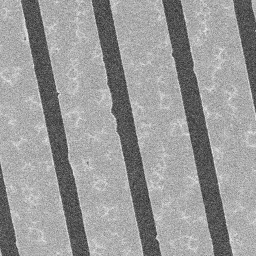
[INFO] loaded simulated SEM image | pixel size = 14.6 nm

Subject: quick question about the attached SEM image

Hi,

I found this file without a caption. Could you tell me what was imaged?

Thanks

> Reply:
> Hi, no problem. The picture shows one or a few lines or trenches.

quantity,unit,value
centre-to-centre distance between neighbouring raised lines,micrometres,1.01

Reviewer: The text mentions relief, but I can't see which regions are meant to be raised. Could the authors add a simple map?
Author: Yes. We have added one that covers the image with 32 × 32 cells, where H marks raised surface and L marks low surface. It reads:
HHHLLHHHHHHHLLHHHHHHLLLHHHHHHLLL
HHHLLHHHHHHHLLHHHHHHLLLHHHHHHLLL
HHHLLHHHHHHHLLHHHHHHHLLHHHHHHLLL
HHHLLLHHHHHHLLHHHHHHHLLHHHHHHHLL
HHHLLLHHHHHHLLLHHHHHHLLLHHHHHHLL
HHHHLLHHHHHHHLLHHHHHHLLLHHHHHHLL
HHHHLLHHHHHHHLLHHHHHHLLLHHHHHHLL
HHHHLLHHHHHHHLLHHHHHHHLLHHHHHHHL
HHHHLLLHHHHHHLLHHHHHHHLLHHHHHHHL
HHHHLLLHHHHHHLLLHHHHHHLLLHHHHHHL
HHHHHLLHHHHHHLLLHHHHHHLLLHHHHHHL
HHHHHLLHHHHHHHLLHHHHHHHLLHHHHHHL
HHHHHLLHHHHHHHLLHHHHHHHLLHHHHHHH
HHHHHLLLHHHHHHLLHHHHHHHLLHHHHHHH
HHHHHLLLHHHHHHLLLHHHHHHLLLHHHHHH
HHHHHHLLHHHHHHLLLHHHHHLLLLHHHHHH
HHHHHHLLHHHHHHHLLHHHHHHLLLHHHHHH
HHHHHHLLHHHHHHHLLHHHHHHHLLHHHHHH
HHHHHHLLLHHHHHHLLHHHHHHHLLHHHHHH
HHHHHHLLLHHHHHHLLLHHHHHHLLLHHHHH
HHHHHHHLLHHHHHHHLLHHHHHHLLLHHHHH
HHHHHHHLLHHHHHHHLLHHHHHHHLLHHHHH
LHHHHHHLLHHHHHHHLLHHHHHHHLLHHHHH
LHHHHHHLLLHHHHHHLLHHHHHHHLLHHHHH
LHHHHHHLLLHHHHHHLLLHHHHHHLLLHHHH
LHHHHHHHLLHHHHHHHLLHHHHHHLLLHHHH
LHHHHHHHLLHHHHHHHLLHHHHHHHLLHHHH
LLHHHHHHLLHHHHHHHLLHHHHHHHLLHHHH
LLHHHHHHLLLHHHHHHLLLHHHHHHLLHHHH
LLHHHHHHHLLHHHHHHLLLHHHHHHLLLHHH
LLHHHHHHHLLHHHHHHHLLHHHHHHHLLHHH
LLHHHHHHHLLHHHHHHHLLHHHHHHHLLHHH